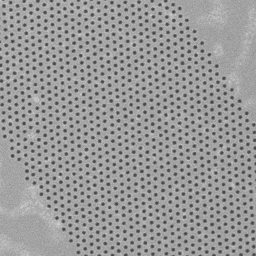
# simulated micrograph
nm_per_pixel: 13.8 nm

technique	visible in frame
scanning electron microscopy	a regular array of holes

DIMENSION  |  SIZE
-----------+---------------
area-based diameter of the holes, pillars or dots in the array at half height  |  0.0541 microns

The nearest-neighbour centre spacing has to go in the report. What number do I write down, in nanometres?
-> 102